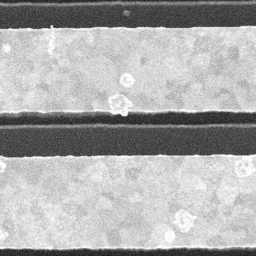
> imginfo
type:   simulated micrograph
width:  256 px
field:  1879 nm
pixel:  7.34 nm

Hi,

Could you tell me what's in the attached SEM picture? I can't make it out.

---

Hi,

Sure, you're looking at lines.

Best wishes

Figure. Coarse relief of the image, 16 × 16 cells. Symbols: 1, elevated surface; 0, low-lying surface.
0000000000000000
0000000000000000
1111111111111111
1111111111111111
1111111111111111
1111111111111111
1111111111111111
0000000000000000
0000000000000000
0000000000000000
1111111111111111
1111111111111111
1111111111111111
1111111111111111
1111111111111111
1111111111100100